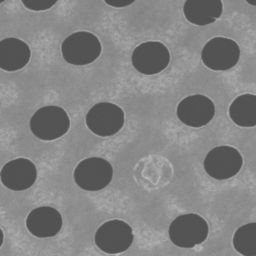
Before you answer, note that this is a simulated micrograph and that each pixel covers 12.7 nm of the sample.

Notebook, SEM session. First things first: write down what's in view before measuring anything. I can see a regular array of holes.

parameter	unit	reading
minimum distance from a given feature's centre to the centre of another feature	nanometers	790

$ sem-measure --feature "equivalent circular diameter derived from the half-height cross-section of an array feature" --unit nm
454